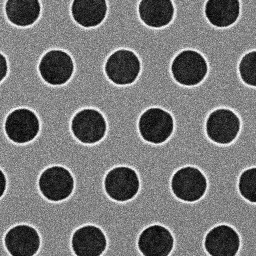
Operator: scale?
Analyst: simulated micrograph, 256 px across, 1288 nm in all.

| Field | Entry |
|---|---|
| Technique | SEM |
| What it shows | a regular array of holes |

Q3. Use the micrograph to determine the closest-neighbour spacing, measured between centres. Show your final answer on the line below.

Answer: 0.334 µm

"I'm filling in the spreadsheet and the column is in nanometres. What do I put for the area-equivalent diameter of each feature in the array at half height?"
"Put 176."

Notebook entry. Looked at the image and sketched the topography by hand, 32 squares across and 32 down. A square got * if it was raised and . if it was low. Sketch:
*....****....****.....****....**
*....****....****.....****....**
*....****....*****...*****...***
********************************
********************************
********************************
******..******...******..******.
.****....****....*****....****..
.****....****....****.....****..
.****....****....*****....****..
******..*******.*******..******.
********************************
********************************
********************************
*....****....*****...*****....**
*....****....****.....****....**
*....****....*****....****....**
*...******..******...*****...***
********************************
********************************
********************************
*****....*****...*****...*****..
.****....****....****.....****..
.****....****....****.....****..
******...*****...*****...*****..
********************************
********************************
********************************
**..******..******...******..***
*....****....****.....****....**
*....****....****.....****....**
*....****....*****...*****....**